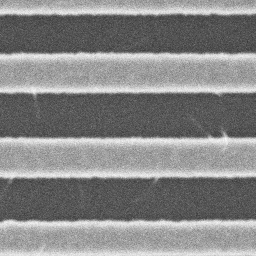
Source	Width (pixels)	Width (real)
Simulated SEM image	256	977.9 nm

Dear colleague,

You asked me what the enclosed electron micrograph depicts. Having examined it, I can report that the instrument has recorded lines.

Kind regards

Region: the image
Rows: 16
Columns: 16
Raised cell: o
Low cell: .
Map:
oooooooooooooooo
................
................
oooooooooooooooo
oooooooooooooooo
oooooooooooooooo
................
................
................
oooooooooooooooo
oooooooooooooooo
................
................
................
oooooooooooooooo
oooooooooooooooo